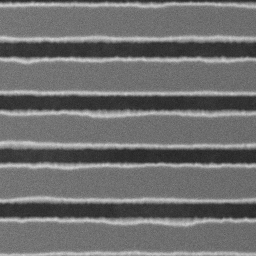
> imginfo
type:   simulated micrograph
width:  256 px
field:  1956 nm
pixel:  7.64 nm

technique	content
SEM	lines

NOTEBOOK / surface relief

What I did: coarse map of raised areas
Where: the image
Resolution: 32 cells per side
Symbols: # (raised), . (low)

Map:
###############################.
################################
################################
################################
################################
................................
................................
################################
################################
################################
################################
################################
................................
................................
################################
################################
################################
################################
...................######..##.#.
................................
.............#....###..##.......
################################
################################
################################
################################
................................
................................
##############...###....########
################################
################################
################################
################################